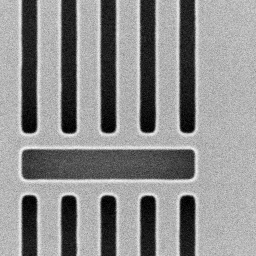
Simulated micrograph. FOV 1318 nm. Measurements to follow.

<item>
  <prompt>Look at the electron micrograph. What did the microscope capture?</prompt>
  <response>groups of lines, slits or small figures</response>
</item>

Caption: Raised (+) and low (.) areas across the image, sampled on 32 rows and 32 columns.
+++..+++..+++..++...++..++++++++
+++..+++..+++..++...++..++++++++
+++..+++..+++..++...++..++++++++
+++..+++..+++..++...++..++++++++
+++..+++..+++..++...++..++++++++
+++..+++..++...++...++..++++++++
+++..+++..++...++...++..++++++++
+++..+++..++...++...++..++++++++
+++..+++..+++..++...++..++++++++
+++..+++..+++..++...++..++++++++
+++..+++..++...++...++..++++++++
+++..+++..+++..++...++..++++++++
+++..+++..+++..++...++..++++++++
+++..+++..+++..++...++..++++++++
+++..+++..+++..++...++..++++++++
+++..+++..+++..++...++..++++++++
+++.++++.++++.++++.++++.++++++++
++++++++++++++++++++++++++++++++
++++++++++++++++++++++++++++++++
+++.....................++++++++
+++.....................++++++++
+++.....................++++++++
++++...................+++++++++
++++++++++++++++++++++++++++++++
+++.++++.++++.++++.++++.++++++++
+++..+++..+++..++...++..++++++++
+++..+++..+++..++...++..++++++++
+++..+++..+++..++...++..++++++++
+++..+++..+++..++...++..++++++++
+++..+++..+++..++...++..++++++++
+++..+++..+++..++...++..++++++++
+++..+++..+++..++...++..++++++++